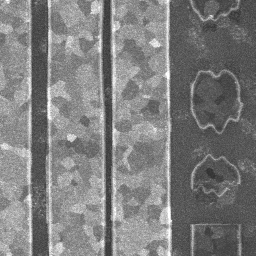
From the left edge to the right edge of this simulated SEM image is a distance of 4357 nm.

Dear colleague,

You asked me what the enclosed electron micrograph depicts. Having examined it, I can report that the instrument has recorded one or a few lines or trenches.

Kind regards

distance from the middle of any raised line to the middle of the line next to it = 1150 nm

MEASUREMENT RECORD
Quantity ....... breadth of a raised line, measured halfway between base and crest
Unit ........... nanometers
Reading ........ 910